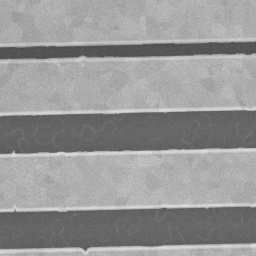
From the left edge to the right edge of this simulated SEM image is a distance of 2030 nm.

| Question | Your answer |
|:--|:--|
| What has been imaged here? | one or a few lines or trenches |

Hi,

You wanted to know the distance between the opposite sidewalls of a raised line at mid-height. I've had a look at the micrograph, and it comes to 0.424 micrometres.